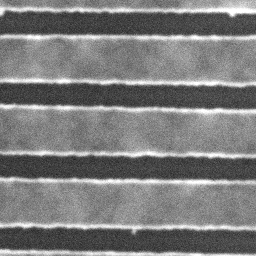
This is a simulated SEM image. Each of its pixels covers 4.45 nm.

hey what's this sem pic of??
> lines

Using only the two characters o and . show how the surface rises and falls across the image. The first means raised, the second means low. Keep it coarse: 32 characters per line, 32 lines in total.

oooooooooooooooooooooooooooooooo
....................o.ooo...oooo
................................
................................
oooo..oo...o....................
oooooooooooooooooooooooooooooooo
oooooooooooooooooooooooooooooooo
oooooooooooooooooooooooooooooooo
oooooooooooooooooooooooooooooooo
oooooooooooooooooooooooooooooooo
.....................ooooooooooo
................................
................................
oooooooooooooooo................
oooooooooooooooooooooooooooooooo
oooooooooooooooooooooooooooooooo
oooooooooooooooooooooooooooooooo
oooooooooooooooooooooooooooooooo
oooooooooooooooooooooooooooooooo
................o.........oooooo
................................
................................
ooooooo..o......................
oooooooooooooooooooooooooooooooo
oooooooooooooooooooooooooooooooo
oooooooooooooooooooooooooooooooo
oooooooooooooooooooooooooooooooo
oooooooooooooooooooooooooooooooo
..........o....ooooooooooooooooo
................................
................................
ooooooooo.......................